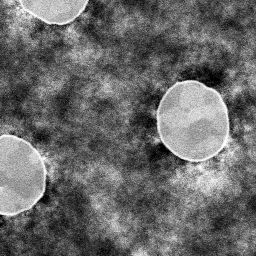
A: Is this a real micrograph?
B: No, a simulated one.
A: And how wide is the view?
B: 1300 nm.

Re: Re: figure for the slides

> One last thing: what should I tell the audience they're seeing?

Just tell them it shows raised bodies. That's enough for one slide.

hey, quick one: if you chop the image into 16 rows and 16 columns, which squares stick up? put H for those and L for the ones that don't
LLHHHLLLLLLLLLLL
LLLLLLLLLLLLLLLL
LLLLLLLLLLLLLLLL
LLLLLLLLLLLLLLLL
LLLLLLLLLLLLLLLL
LLLLLLLLLLLHHLLL
LLLLLLLLLLHHHHLL
LLLLLLLLLLHHHHLL
HLLLLLLLLLHHHHLL
HHLLLLLLLLLHHHLL
HHHLLLLLLLLLLLLL
HHHLLLLLLLLLLLLL
HHLLLLLLLLLLLLLL
LLLLLLLLLLLLLLLL
LLLLLLLLLLLLLLLL
LLLLLLLLLLLLLLLL